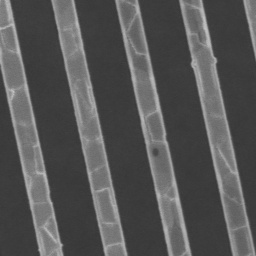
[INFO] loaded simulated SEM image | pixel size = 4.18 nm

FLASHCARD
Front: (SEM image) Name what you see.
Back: parallel lines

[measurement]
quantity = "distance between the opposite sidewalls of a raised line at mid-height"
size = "89.9 nanometres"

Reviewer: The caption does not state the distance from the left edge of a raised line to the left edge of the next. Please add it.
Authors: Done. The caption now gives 262 nm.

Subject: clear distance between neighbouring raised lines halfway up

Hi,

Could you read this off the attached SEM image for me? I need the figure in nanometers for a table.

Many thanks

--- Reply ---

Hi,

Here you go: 172